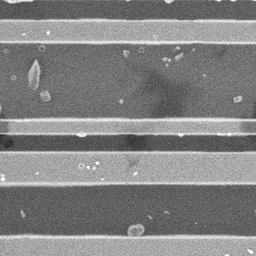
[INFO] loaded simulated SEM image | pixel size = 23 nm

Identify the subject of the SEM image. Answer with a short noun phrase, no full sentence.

lines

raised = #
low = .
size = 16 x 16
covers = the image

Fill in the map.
################
################
################
................
................
................
................
................
################
################
################
................
................
................
................
################